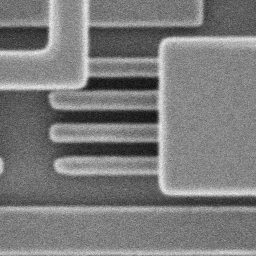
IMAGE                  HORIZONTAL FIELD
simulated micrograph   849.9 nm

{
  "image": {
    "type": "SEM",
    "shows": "wiring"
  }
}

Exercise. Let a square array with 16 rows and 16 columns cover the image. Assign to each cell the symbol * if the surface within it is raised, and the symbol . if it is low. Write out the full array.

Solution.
...**...........
...**...........
...**.....******
*****.....******
*****.....******
*****.....******
..........******
..........******
..........******
..........******
..........******
..........******
................
................
................
................